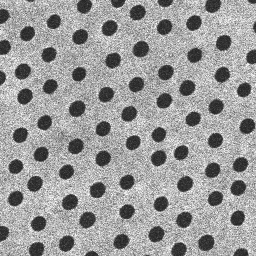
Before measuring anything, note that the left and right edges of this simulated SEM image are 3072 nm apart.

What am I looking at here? a regular array of holes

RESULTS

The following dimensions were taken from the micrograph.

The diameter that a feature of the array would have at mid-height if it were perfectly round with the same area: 187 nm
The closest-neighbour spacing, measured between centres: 342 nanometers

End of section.